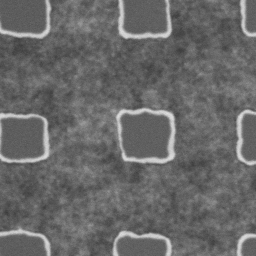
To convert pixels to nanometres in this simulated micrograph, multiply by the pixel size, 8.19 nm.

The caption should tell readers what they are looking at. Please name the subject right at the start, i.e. raised bodies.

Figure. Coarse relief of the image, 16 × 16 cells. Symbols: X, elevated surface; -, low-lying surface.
XXX-----XXX----X
XXX-----XXX----X
----------------
----------------
----------------
----------------
----------------
XXX----XXXX----X
XXX----XXXX----X
XXX-----XXX----X
----------------
----------------
----------------
----------------
-X--------------
XXX----XXXX----X